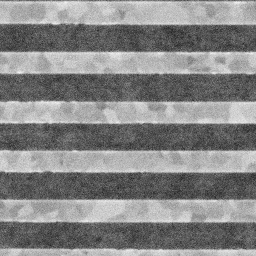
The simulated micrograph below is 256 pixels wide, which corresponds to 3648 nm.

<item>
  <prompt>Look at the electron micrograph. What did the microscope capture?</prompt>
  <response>lines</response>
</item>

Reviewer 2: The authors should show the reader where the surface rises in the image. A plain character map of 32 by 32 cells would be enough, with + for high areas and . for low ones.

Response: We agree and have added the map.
++++++++++++++++++++++++++++++++
++++++++++++++++++++++++++++++++
++++++++++++++++++++++++++++++++
................................
................................
................................
................................
++++++++++++++++++++++++++++++++
++++++++++++++++++++++++++++++++
................................
................................
................................
................................
++++++++++++++++++++++++++++++++
++++++++++++++++++++++++++++++++
................................
................................
................................
................................
++++++++++++++++++++++++++++++++
++++++++++++++++++++++++++++++++
................................
................................
................................
................................
++++++++++++++++++++++++++++++++
++++++++++++++++++++++++++++++++
++++++++++++++++++++++++++++++++
................................
................................
................................
++++++++++++++++++++++++++++++++